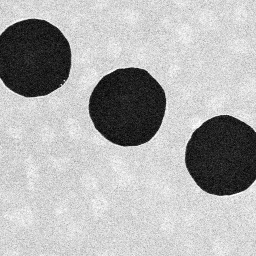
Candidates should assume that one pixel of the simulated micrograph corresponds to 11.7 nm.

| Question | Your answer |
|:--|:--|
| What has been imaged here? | holes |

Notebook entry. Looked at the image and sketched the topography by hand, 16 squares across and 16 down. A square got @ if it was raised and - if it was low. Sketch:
@@@@@@@@@@@@@@@@
@--@@@@@@@@@@@@@
----@@@@@@@@@@@@
----@@@@@@@@@@@@
----@@@--@@@@@@@
@---@@----@@@@@@
@@@@@@----@@@@@@
@@@@@@----@@@--@
@@@@@@----@@----
@@@@@@@@@@@@----
@@@@@@@@@@@@----
@@@@@@@@@@@@----
@@@@@@@@@@@@@@@@
@@@@@@@@@@@@@@@@
@@@@@@@@@@@@@@@@
@@@@@@@@@@@@@@@@